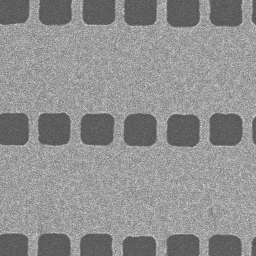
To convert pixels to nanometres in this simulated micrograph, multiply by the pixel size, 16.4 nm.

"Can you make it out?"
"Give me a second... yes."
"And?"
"holes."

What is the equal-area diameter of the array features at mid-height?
0.586 micrometres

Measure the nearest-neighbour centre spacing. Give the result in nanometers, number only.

702